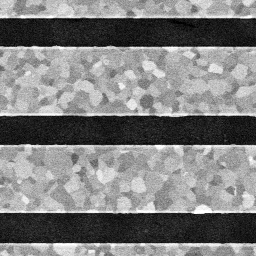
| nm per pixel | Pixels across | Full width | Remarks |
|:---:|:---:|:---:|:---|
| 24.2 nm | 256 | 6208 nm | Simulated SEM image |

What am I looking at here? lines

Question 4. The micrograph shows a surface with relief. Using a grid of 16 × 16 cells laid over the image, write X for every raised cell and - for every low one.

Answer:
XXXXXXXXXXXXXXXX
----------------
----------------
XXXXXXXXXXXXXXXX
XXXXXXXXXXXXXXXX
XXXXXXXXXXXXXXXX
XXXXXXXXXXXXXXXX
----------------
----------------
XXXXXXXXXXXXXXXX
XXXXXXXXXXXXXXXX
XXXXXXXXXXXXXXXX
XXXXXXXXXXXXXXXX
----------------
----------------
XXXXXXXXXXXXXXXX